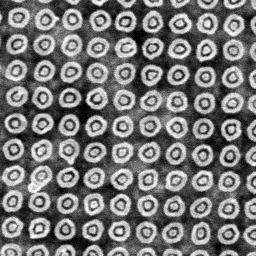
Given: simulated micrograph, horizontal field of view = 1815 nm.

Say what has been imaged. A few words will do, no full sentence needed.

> a regular array of ring-shaped raised bodies with a dot in the middle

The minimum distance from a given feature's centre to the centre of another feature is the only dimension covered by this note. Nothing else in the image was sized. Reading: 182 nm